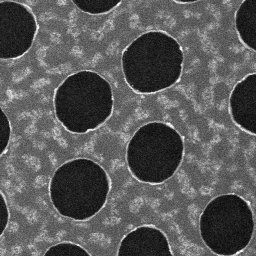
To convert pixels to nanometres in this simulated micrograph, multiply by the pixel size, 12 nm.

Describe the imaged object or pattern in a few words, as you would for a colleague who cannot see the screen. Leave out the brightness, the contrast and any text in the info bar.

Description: holes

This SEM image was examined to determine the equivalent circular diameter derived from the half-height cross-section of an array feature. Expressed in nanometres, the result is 713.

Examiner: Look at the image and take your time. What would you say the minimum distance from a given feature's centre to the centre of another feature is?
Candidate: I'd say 976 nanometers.